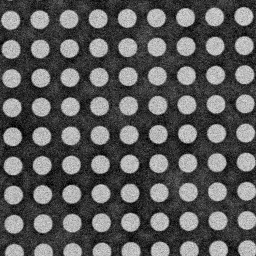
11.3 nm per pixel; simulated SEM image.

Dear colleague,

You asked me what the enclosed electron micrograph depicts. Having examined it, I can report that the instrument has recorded an array of small figures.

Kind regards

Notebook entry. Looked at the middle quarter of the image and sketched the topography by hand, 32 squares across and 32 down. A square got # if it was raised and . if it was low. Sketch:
................................
###....###....####....###....###
####...####...####...####...####
####...####...####...####...####
###....####...####....###....###
.#..............................
................................
................................
........##.....##.....###....###
####...####...####...#####...###
####...####...####...#####...###
####...####...####....###....###
###.....##.....##...............
................................
................................
.......................#......##
####...####...####....####...###
####...####...####...#####...###
####...####...####....####...###
###....####....###....###.....##
................................
................................
................................
.##.....###....###....###....###
####...####...#####...####...###
####...####...#####...####...###
####...####....###....###.....##
................................
................................
................................
.##.....##.....###....###....###
####...####...#####...####...###